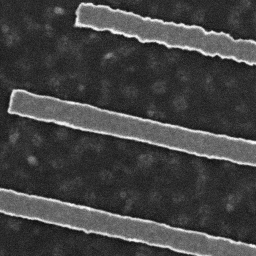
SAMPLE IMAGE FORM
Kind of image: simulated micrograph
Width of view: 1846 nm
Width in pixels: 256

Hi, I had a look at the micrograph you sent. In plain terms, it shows one or a few lines or trenches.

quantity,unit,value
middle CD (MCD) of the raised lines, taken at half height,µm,0.165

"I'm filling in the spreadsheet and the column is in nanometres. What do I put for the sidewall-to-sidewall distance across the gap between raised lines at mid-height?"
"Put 549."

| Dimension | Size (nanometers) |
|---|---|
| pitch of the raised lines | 714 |